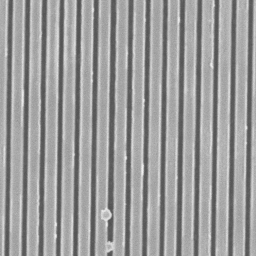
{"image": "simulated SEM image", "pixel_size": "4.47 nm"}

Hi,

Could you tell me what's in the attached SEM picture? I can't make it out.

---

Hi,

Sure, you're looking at parallel lines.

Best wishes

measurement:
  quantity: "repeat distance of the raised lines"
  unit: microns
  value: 0.0769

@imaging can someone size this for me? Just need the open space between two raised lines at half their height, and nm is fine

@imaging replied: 25.2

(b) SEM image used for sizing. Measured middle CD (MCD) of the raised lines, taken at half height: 50.9 nm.